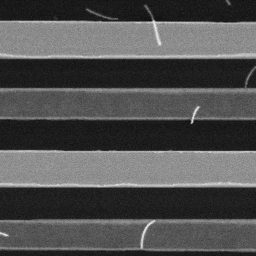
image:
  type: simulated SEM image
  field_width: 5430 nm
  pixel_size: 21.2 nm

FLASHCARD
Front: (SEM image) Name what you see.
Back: lines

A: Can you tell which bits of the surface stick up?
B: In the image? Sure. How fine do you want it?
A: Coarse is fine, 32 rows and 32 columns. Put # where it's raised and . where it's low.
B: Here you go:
................................
................................
................................
################################
################################
################################
################################
................................
................................
................................
................................
################################
################################
################################
################################
................................
................................
................................
................................
################################
################################
################################
################################
................................
................................
................................
................................
....############################
################################
################################
################################
................................